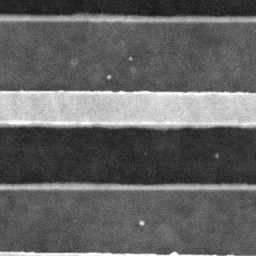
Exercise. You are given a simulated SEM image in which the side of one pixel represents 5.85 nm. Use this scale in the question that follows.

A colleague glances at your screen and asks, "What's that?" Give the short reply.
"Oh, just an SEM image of lines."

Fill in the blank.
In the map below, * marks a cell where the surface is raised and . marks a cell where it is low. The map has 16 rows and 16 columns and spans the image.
................
****************
****************
****************
****************
****************
****************
****************
................
................
................
................
****************
****************
****************
****************